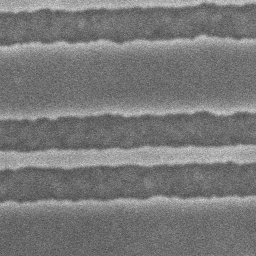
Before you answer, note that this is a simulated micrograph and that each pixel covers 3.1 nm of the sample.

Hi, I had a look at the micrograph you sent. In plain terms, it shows lines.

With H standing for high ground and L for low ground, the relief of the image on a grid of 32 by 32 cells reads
HHHHHHHHHHHHHHHHHHHHHHHHHLLHHHHL
HHLLLLLLLLLLLLLLLLLLLLLLLLLLLLLL
LLLLLLLLLLLLLLLLLLLLLLLLLLLLLLLL
LLLLLLLLLLLLLLLLLLLLLLLLLLLLLLLL
LLLLLLLLLLLLLLLLLLLLLLLLLLLLLLLL
LLLHHLHHHLHHHHHHHHHHHHHHHHHHHHHH
HHHHHHHHHHHHHHHHHHHHHHHHHHHHHHHH
HHHHHHHHHHHHHHHHHHHHHHHHHHHHHHHH
HHHHHHHHHHHHHHHHHHHHHHHHHHHHHHHH
HHHHHHHHHHHHHHHHHHHHHHHHHHHHHHHH
HHHHHHHHHHHHHHHHHHHHHHHHHHHHHHHH
HHHHHHHHHHHHHHHHHHHHHHHHHHHHHHHH
HHHHHHHHHHHHHHHHHHHHHHHHHHHHHHHH
HHHHHHHHHHHHHHHHHHHHHHHHHHHHHHHH
HHHHHHHHLLHLLLLLLLLLLLLLLLLLLLLL
LLLLLLLLLLLLLLLLLLLLLLLLLLLLLLLL
LLLLLLLLLLLLLLLLLLLLLLLLLLLLLLLL
LLLLLLLLLLLLLLLLLLLLLLLLLLLLLLLL
LLLLLLLLLLLLLLLLLHHHHHHHHHHHHHHH
HHHHHHHHHHHHHHHHHHHHHHHHHHHHHHHH
HHHHHHHHHHHHHHHHLHHHLHLLLLLLLLLL
LLLLLLLLLLLLLLLLLLLLLLLLLLLLLLLL
LLLLLLLLLLLLLLLLLLLLLLLLLLLLLLLL
LLLLLLLLLLLLLLLLLLLLLLLLLLLLLLLL
LLLLLLLLLLLLLLLLLLLLLLLLLLLLLLLL
HHHHHHHHHHHHHHHHHHHHHHHHHHHHHHHH
HHHHHHHHHHHHHHHHHHHHHHHHHHHHHHHH
HHHHHHHHHHHHHHHHHHHHHHHHHHHHHHHH
HHHHHHHHHHHHHHHHHHHHHHHHHHHHHHHH
HHHHHHHHHHHHHHHHHHHHHHHHHHHHHHHH
HHHHHHHHHHHHHHHHHHHHHHHHHHHHHHHH
HHHHHHHHHHHHHHHHHHHHHHHHHHHHHHHH